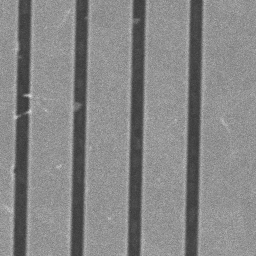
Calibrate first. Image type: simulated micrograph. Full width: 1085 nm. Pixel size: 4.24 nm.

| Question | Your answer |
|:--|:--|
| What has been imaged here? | parallel lines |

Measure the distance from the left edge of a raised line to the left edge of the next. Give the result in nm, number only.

242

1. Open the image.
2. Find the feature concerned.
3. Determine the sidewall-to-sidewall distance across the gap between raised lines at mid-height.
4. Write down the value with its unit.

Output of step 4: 12.9 pixels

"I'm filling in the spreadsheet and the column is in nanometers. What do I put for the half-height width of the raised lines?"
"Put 188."